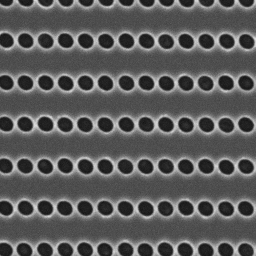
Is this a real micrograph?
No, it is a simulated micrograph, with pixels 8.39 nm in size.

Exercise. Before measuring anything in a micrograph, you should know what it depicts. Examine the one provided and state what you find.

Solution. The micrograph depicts a regular array of holes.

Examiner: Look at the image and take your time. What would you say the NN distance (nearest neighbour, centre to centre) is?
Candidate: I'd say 166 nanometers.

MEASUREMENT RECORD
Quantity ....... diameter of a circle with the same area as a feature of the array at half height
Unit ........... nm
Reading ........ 130